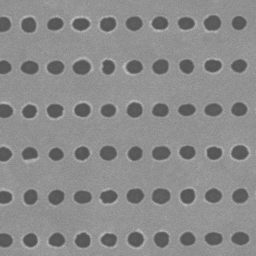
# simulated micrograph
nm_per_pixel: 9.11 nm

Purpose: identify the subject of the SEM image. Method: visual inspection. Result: a regular array of holes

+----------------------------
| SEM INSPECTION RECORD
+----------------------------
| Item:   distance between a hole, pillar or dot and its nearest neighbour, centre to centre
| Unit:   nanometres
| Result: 237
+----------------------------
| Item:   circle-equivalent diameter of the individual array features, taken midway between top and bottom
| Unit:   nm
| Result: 143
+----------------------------